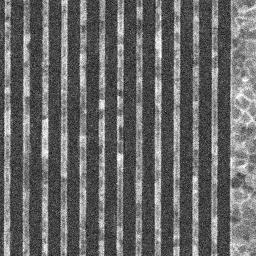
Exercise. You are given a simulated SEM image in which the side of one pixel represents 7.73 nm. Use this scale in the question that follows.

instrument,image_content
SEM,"parallel lines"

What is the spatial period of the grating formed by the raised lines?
0.146 microns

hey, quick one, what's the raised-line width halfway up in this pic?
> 39.6 nanometres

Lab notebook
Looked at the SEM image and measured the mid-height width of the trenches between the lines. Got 107 nanometers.